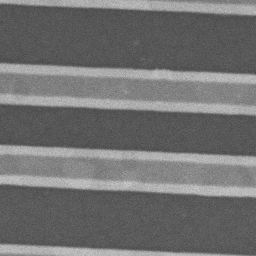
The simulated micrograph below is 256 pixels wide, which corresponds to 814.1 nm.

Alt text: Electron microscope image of one or a few lines or trenches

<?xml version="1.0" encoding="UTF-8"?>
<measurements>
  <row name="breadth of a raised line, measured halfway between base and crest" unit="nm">98.7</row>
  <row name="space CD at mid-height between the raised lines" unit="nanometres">217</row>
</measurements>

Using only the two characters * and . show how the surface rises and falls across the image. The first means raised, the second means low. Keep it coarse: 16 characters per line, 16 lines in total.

.............***
................
................
................
******..........
****************
......**********
................
................
****............
****************
.....***********
................
................
................
................